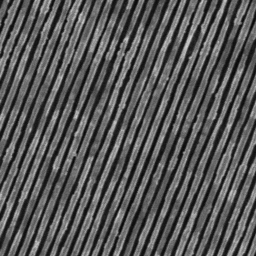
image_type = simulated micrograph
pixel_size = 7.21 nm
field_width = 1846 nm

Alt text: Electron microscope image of parallel lines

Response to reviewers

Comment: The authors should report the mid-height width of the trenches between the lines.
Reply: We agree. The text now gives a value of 4.77 pixels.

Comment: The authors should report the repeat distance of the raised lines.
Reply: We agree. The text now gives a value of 70 nm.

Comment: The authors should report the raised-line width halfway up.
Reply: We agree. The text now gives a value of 35.2 nanometres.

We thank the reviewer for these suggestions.